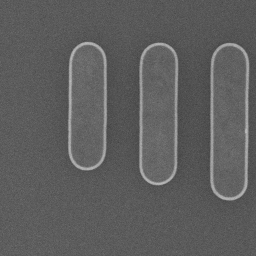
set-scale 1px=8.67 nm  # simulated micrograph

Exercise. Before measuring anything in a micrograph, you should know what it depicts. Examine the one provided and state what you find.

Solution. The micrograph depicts groups of lines, slits or small figures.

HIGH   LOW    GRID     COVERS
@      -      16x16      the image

----------------
----------------
----------------
----@@---@@--@@-
----@@@--@@--@@-
----@@@--@@--@@-
----@@@--@@--@@-
----@@@--@@--@@-
----@@@--@@--@@-
----@@@--@@--@@-
-----@---@@--@@-
-------------@@-
----------------
----------------
----------------
----------------